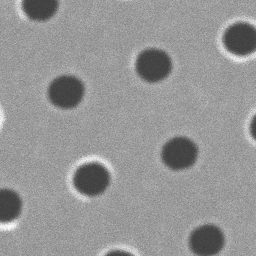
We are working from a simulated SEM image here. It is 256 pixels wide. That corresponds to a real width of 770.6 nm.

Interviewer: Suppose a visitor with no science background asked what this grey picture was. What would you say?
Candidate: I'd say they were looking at holes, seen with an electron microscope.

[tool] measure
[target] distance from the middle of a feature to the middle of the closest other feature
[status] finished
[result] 274 nanometers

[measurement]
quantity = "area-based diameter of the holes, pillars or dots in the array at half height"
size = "36.2 pixels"